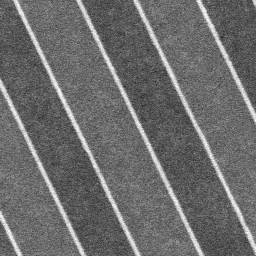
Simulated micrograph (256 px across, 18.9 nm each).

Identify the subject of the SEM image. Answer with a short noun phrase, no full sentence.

one or a few lines or trenches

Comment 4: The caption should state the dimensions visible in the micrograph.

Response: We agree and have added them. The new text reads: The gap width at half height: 1.08 um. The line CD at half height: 973 nm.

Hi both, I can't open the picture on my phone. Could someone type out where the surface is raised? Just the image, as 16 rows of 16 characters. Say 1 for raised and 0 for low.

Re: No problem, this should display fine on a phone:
1000011110000111
1100001110000111
1100001111000011
1110000111000011
1110000111100001
1111000011100001
0111000011110000
0111100011110000
0011100001111000
0011110001111000
0001110000111100
0001110000111100
0000111000011110
0000111000011110
1000111100001110
1000011100001111